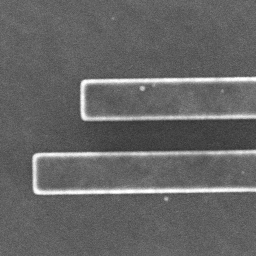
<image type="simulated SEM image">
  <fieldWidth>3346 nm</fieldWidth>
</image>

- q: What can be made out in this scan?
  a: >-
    groups of lines, slits or small figures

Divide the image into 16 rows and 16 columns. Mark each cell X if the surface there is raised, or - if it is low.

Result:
----------------
----------------
----------------
----------------
----------------
-----XXXXXXXXXXX
-----XXXXXXXXXXX
----------------
----------------
---------------X
--XXXXXXXXXXXXXX
--XXXXXXXXXXXXXX
----------------
----------------
----------------
----------------